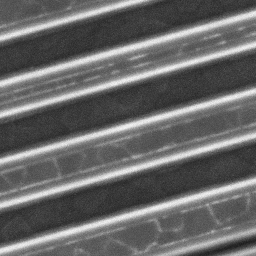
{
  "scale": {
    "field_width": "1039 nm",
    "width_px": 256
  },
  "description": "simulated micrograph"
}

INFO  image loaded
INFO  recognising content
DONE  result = one or a few lines or trenches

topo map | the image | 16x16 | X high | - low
XXXXXXX---------
XXX-----------XX
----------XXXXXX
------XXXXXXX---
---XXXXXXX------
XXXXXX----------
XX-----------XXX
---------XXXXXXX
------XXXXXXXXXX
--XXXXXXXXXX----
XXXXXXXXX-------
XXXXX----------X
X-----------XXXX
--------XXXXXXXX
----XXXXXXXXXXXX
-XXXXXXXXXXX----